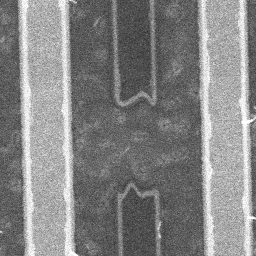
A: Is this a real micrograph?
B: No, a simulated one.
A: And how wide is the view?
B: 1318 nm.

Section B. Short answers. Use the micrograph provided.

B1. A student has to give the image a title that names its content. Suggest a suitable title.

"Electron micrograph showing one or a few lines or trenches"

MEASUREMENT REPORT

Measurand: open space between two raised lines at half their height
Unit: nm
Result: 259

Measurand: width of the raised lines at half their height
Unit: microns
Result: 0.201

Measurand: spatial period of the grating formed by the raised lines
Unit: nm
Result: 460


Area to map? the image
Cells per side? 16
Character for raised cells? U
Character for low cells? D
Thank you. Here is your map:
DUUUDDDUUDDDDUUD
DDUUDDDUUUDDDUUD
DDUUDDDUUUDDDUUD
DDUUDDDUUUDDDUUD
DDUUDDDUUUDDDUUD
DDUUDDDUUUDDDUUD
DDUUDDDDDDDDDUUD
DDUUDDDDDDDDDUUD
DDUUDDDDDDDDDUUD
DDUUDDDDDDDDDUUD
DDUUDDDDDDDDDUUD
DDUUDDDDDDDDDUUD
DDUUDDDDUUDDDUUD
DDUUDDDUUUDDDUUD
DDUUDDDUUUDDDUUD
DDUUDDDDUUDDDUUU